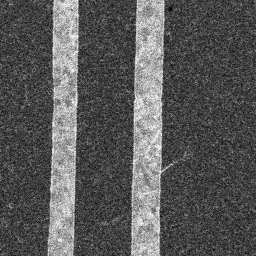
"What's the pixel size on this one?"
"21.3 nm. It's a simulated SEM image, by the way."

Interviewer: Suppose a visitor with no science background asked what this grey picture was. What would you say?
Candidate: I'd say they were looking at one or a few lines or trenches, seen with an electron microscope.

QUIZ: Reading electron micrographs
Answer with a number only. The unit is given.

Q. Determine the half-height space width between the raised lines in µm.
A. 1.24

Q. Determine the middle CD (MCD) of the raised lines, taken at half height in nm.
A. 541